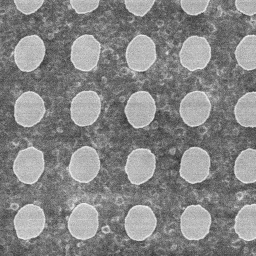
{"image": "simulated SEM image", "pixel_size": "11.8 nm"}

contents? a regular array of raised bodies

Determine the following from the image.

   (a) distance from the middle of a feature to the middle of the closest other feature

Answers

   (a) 387 nanometers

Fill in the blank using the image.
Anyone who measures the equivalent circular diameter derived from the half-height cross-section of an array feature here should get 386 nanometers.